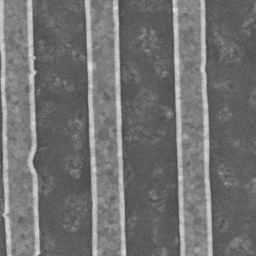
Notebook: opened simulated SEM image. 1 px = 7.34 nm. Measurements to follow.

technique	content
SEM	one or a few lines or trenches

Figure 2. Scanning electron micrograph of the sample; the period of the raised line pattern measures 0.636 um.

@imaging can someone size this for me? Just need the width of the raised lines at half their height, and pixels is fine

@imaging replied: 28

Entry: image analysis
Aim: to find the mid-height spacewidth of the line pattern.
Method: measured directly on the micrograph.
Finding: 433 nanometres